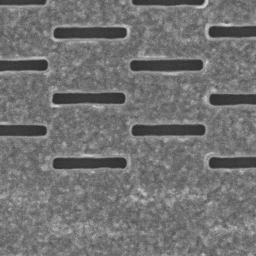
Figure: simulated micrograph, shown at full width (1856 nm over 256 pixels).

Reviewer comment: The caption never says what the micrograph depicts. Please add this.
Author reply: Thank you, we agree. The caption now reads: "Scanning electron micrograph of holes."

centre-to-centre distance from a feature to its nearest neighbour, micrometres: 0.472